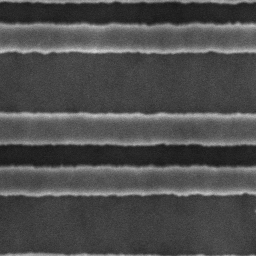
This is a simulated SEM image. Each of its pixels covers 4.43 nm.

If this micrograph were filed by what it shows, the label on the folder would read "lines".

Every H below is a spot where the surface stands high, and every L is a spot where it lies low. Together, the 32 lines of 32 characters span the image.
LLLLLLLLLLLLLLLLLLLLLLLLLLLLLLLL
LLLLLLLLLLLLLLLLLLLLLLLLLLLLLLLL
LLLLLLLLLLLLLLLLLLLLLLLLLLLLLLLL
HHHHHHHHHHHHHHHHHHHHHHHHHHHHHHHH
HHHHHHHHHHHHHHHHHHHHHHHHHHHHHHHH
HHHHHHHHHHHHHHHHHHHHHHHHHHHHHHHH
LLHHLHLLLLLHHLHLLHHHHHHLHHLLHHLL
LLLLLLLLLLLLLLLLLLLLLLLLLLLLLLLL
LLLLLLLLLLLLLLLLLLLLLLLLLLLLLLLL
LLLLLLLLLLLLLLLLLLLLLLLLLLLLLLLL
LLLLLLLLLLLLLLLLLLLLLLLLLLLLLLLL
LLLLLLLLLLLLLLLLLLLLLLLLLLLLLLLL
LLLLLLLLLLLLLLLLLLLLLLLLLLLLLLLL
LLLLLLLLLLLLLLLLLLLLLLLLLLLLLLLL
HHHHHHHHHHHHHHHHHHHHHHHHHHHHHHHH
HHHHHHHHHHHHHHHHHHHHHHHHHHHHHHHH
HHHHHHHHHHHHHHHHHHHHHHHHHHHHHHHH
HHHHHHHHHHHHHHHHHHHHHHHHHHHHHHHH
LLLLLLLLLLLLLLLLLLLLLLLLLLLLLLLL
LLLLLLLLLLLLLLLLLLLLLLLLLLLLLLLL
LLLLLLLLLLLLLLLLLLLLLLLLLLLLLLLL
HHHHHHHHHHHHHHHHHHHHHHHHHHHHHHHH
HHHHHHHHHHHHHHHHHHHHHHHHHHHHHHHH
HHHHHHHHHHHHHHHHHHHHHHHHHHHHHHHH
LLLLLLLLLLLLLLLLLLLLLLLLLLLLLLLL
LLLLLLLLLLLLLLLLLLLLLLLLLLLLLLLL
LLLLLLLLLLLLLLLLLLLLLLLLLLLLLLLL
LLLLLLLLLLLLLLLLLLLLLLLLLLLLLLLL
LLLLLLLLLLLLLLLLLLLLLLLLLLLLLLLL
LLLLLLLLLLLLLLLLLLLLLLLLLLLLLLLL
LLLLLLLLLLLLLLLLLLLLLLLLLLLLLLLL
LLLLLLLLLLLLLLLLLLLLLLLLLLLLLLLL